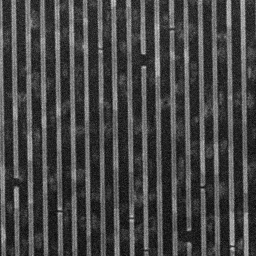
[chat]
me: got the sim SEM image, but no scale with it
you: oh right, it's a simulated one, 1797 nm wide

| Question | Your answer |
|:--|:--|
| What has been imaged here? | parallel lines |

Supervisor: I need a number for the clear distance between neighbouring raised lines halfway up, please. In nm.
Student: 76.4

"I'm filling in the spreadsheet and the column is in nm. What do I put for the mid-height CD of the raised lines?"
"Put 19.3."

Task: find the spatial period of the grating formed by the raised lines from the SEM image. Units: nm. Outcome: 100